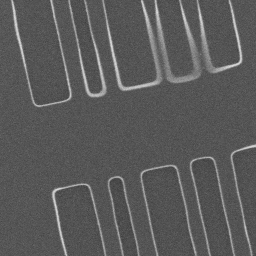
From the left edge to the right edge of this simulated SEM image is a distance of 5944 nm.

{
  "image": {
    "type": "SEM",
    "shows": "groups of lines, slits or small figures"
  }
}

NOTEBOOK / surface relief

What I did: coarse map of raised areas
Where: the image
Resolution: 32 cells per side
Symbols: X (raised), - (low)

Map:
XX----XXX--XX-----XX---XX----XXX
XX-----XX--XX-----XX---XX----XXX
XX-----XX--XX-----XX---XX----XXX
XX-----XX--XX------X---XX----XXX
XX-----XXX--XX-----X----X-----XX
XX------XX--XX-----X----XX----XX
XXX-----XX--XX-----X----XX----XX
XXX-----XX--XX------X---XX----XX
XXX-----XX---XX-----X----X--XXXX
XXX-----XXX--XX-----X---XXXXXXXX
XXXX-----XX--XX----XXXXXXXXXXXXX
XXXX-----XX--XXXXXXXXXXXXXXXXXXX
XXXX----XXXXXXXXXXXXXXXXXXXXXXXX
XXXXXXXXXXXXXXXXXXXXXXXXXXXXXXXX
XXXXXXXXXXXXXXXXXXXXXXXXXXXXXXXX
XXXXXXXXXXXXXXXXXXXXXXXXXXXXXXXX
XXXXXXXXXXXXXXXXXXXXXXXXXXXXXXXX
XXXXXXXXXXXXXXXXXXXXXXXXXXXXXXXX
XXXXXXXXXXXXXXXXXXXXXXXXXXXXXXX-
XXXXXXXXXXXXXXXXXXXXXXXXXXXXX---
XXXXXXXXXXXXXXXXXXXXXXXX---XX---
XXXXXXXXXXXXXXXXXX----XX---XX---
XXXXXXXXXXXXXX-XXX----XX---XXX--
XXXXXXXX---XXX--XX-----X---XXX--
XXXXXXX-----XX--XX-----XX---XX--
XXXXXXX-----XX--XX-----XX---XX--
XXXXXXX-----XX--XXX----XX---XX--
XXXXXXX-----XX--XXX----XX---XX--
XXXXXXX------XX--XX-----XX---XX-
XXXXXXXX-----XX--XX-----XX---XX-
XXXXXXXX-----XX--XX-----XX---XX-
XXXXXXXX-----XX--XXX----XX---XX-